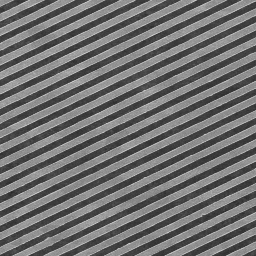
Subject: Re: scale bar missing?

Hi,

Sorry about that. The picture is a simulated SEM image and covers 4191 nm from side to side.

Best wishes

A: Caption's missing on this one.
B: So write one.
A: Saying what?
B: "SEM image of parallel lines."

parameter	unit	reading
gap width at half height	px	6.77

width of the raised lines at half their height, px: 6.31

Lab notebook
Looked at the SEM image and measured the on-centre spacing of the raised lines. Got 0.215 micrometres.